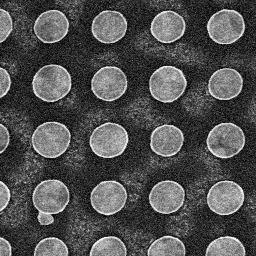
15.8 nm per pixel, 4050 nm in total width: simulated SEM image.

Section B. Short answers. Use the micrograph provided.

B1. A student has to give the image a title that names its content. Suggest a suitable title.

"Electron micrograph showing a regular array of raised bodies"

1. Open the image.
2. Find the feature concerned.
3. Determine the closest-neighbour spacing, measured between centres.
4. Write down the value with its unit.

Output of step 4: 897 nanometers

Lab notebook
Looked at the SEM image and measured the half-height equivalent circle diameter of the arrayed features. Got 0.546 micrometres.